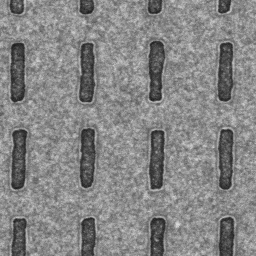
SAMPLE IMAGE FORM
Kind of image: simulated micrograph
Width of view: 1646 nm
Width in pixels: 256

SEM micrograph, a regular array of holes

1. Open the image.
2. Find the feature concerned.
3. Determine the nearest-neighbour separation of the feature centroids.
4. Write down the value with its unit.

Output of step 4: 443 nanometers